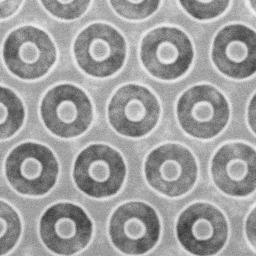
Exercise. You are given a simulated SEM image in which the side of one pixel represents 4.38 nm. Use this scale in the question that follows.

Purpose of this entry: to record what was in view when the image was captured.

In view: a regular array of ring-shaped grooves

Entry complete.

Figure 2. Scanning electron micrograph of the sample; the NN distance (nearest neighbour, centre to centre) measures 0.29 um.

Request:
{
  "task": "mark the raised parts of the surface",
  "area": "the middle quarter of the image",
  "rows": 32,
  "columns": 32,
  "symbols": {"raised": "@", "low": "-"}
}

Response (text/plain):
@@@------------@@@@@------------
@@@@----------@@@@@@@----------@
@@@@@--------@@@@@@@@---------@@
@@@@@@@@@-@@@@@@@@@@@@@------@@@
@@@@@@@@@@@@@@@@@@@@@@@@@@@@@@@@
---@@@@@@@@@@@------@@@@@@@@@@@@
-----@@@@@@@@--------@@@@@@@@@@-
------@@@@@@-----------@@@@@@@--
------@@@@@@-----------@@@@@@---
@@-----@@@@------@@-----@@@@----
@@@----@@@@-----@@@@----@@@@----
@@@-----@@@----@@@@@----@@@@----
@@@-----@@@----@@@@@----@@@@----
@@@----@@@@-----@@@@----@@@@----
@@-----@@@@-------------@@@@@---
-------@@@@@-----------@@@@@@---
------@@@@@@@---------@@@@@@@@--
-----@@@@@@@@@-------@@@@@@@@@@-
--@@@@@@@@@@@@@@@@-@@@@@@@@@@@@@
@@@@@@@@@@@@@@@@@@@@@@@@@@@@@@@@
@@@@@@------@@@@@@@@@@@@------@@
@@@@@--------@@@@@@@@@---------@
@@@@----------@@@@@@@-----------
@@@------------@@@@@@-----------
@@@------------@@@@@-----@@-----
@@-----@@@@----@@@@@-----@@@@---
@@----@@@@@-----@@@@----@@@@@---
@@-----@@@@----@@@@@----@@@@@---
@@-----@@@@----@@@@@-----@@@----
@@@------------@@@@@@-----------
@@@-----------@@@@@@@@----------
@@@@----------@@@@@@@@@---------